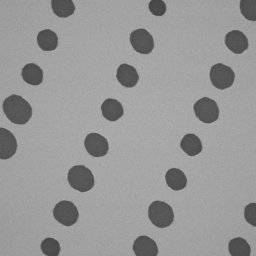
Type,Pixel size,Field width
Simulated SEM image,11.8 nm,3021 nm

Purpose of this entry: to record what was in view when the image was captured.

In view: a regular array of holes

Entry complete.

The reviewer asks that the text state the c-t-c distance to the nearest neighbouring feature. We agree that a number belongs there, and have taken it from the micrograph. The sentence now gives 441 nanometers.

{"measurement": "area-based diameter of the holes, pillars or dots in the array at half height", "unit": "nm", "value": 290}